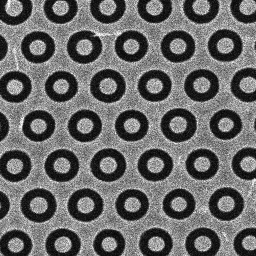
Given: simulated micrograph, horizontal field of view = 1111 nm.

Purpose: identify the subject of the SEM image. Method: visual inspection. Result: a regular array of ring-shaped grooves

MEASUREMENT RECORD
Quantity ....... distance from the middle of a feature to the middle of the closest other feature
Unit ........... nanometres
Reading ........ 198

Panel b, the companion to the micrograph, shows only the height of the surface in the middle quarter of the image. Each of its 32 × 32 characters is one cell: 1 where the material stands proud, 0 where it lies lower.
11111111111111111111111111111111
11111111110011111111110011111111
00111111000000111111000000111110
00011110000000011110000000011110
10011110011110011110011100011100
10001100011110011100011100011100
10011110011110011100011100011100
00011110000000011110000000111110
00111111000000111111000001111110
11111111100011111111110111111111
11111111111111111111111111111111
11110011111111110011111111000001
11100000111111000000111110000000
11000000011110000000011110001100
10011110011110011110011100011110
10011110001110011110011100111110
10001110011110001110011100011100
10000000011110000000011110000000
11000000111111000000111111000000
11110001111111111111111111100011
11111111111111111111111111111111
01111111100001111111100001111111
00011111000000111111000000111110
00001110001100011110001100011110
10001110011110001100011110011100
10001100011110001100011110011100
10001110011110011110011100011110
00011110000000011110000000011110
00011111000000111111000000111111
01111111111111111111110111111111
11111111111111111111111111111111
11110001111111100001111111100011